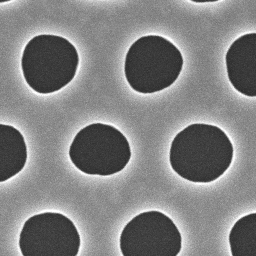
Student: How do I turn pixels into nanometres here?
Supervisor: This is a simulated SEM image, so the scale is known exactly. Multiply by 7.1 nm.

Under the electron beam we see holes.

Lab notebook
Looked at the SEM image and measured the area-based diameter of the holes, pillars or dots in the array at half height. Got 416 nm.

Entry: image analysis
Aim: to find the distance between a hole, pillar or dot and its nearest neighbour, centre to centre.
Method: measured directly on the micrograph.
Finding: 714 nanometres